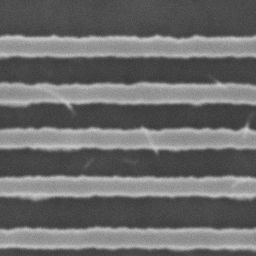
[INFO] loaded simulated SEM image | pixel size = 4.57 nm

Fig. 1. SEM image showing lines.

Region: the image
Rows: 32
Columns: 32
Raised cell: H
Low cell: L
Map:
LLLLLLLLLLLLLLLLLLLLLLLLLLLLLLLL
LLLLLLLLLLLLLLLLLLLLLLLLLLLLLLLL
LLLLLLLLLLLLLLLLLLLLLLLLLLLLLLLL
LLLLLLLLLLLLLLLLLLLLLLLLLLLLLLLL
LLLLLLLLLLLLLLLLLLLLLLLLLLLLLLLL
HHHHHHHHHHHHHHHHHHHHHHHHHHHHHHHH
HHHHHHHHHHHHHHHHHHHHHHHHHHHHHHHH
LLLLLLLLLLLLLLLLLLLLLLLLLLLLLLLL
LLLLLLLLLLLLLLLLLLLLLLLLLLLLLLLL
LLLLLLLLLLLLLLLLLLLLLLLLLLLLLLLL
HHHLLHLLLLLLHHLLLHHHHLLLLLLHHHLL
HHHHHHHHHHHHHHHHHHHHHHHHHHHHHHHH
HHHHHHHHHHHHHHHHHHHHHHHHHHHHHHHH
LLLLLLLLLLLLLLLLLLLLLLLLLLLLLLLL
LLLLLLLLLLLLLLLLLLLLLLLLLLLLLLLL
LLLLLLLLLLLLLLLLLLLLLLLLLLLLLLLL
HHHHHHHHHHHHHHHHHHHHHHHHHHHHHHHH
HHHHHHHHHHHHHHHHHHHHHHHHHHHHHHHH
LLLLLLLLLLLLLHLHHHHHHHHHHLLHLLHH
LLLLLLLLLLLLLLLLLLLLLLLLLLLLLLLL
LLLLLLLLLLLLLLLLLLLLLLLLLLLLLLLL
LLLLLLLLLLLLLLLLLLLLLLLLLLLLLLLL
HHHHHHHHHHHHHHHHHHHHHHHHHHHHHHHH
HHHHHHHHHHHHHHHHHHHHHHHHHHHHHHHH
LLLLLLHLHHHLLLLLHLLLLHLLLLHHHHHH
LLLLLLLLLLLLLLLLLLLLLLLLLLLLLLLL
LLLLLLLLLLLLLLLLLLLLLLLLLLLLLLLL
LLLLLLLLLLLLLLLLLLLLLLLLLLLLLLLL
LLLLLLLLLLLLHLLLLLLLLLLLLLLLLLLL
HHHHHHHHHHHHHHHHHHHHHHHHHHHHHHHH
HHHHHHHHHHHHHHHHHHHHHHHHHHHHHHHH
LLLLLLLLLLLLLLLLLLLLLLLLLLLLLLLL